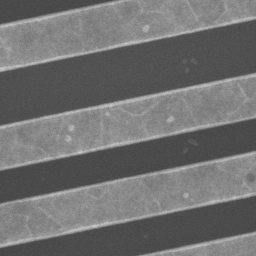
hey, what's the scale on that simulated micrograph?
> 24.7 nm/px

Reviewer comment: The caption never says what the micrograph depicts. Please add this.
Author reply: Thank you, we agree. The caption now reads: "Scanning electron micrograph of lines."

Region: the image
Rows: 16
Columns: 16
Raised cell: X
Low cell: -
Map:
-----XXXXXXXXXXX
XXXXXXXXXXXXXX--
XXXXXXXXX-------
XXXXX-----------
----------------
------------XXXX
-------XXXXXXXXX
--XXXXXXXXXXXXX-
XXXXXXXXXX------
XXXXXX----------
X----------XXXXX
------XXXXXXXXXX
-XXXXXXXXXXXXX--
XXXXXXXXXX------
XXXXX-----------
-----------XXXXX